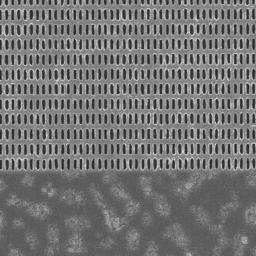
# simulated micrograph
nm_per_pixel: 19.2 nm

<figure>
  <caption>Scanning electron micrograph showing a regular array of holes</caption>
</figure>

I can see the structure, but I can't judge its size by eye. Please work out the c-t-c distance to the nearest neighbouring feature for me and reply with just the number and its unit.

113 nm